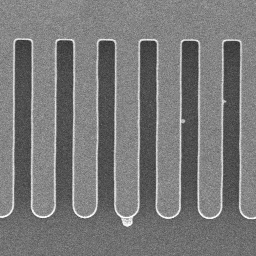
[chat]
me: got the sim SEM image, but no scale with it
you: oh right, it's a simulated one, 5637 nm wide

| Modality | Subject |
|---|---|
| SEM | groups of lines, slits or small figures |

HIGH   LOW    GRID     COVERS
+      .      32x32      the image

++++++++++++++++++++++++++++++++
++++++++++++++++++++++++++++++++
++++++++++++++++++++++++++++++++
++++++++++++++++++++++++++++++++
++++++++++++++++++++++++++++++++
++..+++..+++..++++..+++..+++..++
++..+++..+++..+++...+++..+++..++
++..+++..+++..+++...+++..+++..++
++..+++..+++..+++...+++..+++..++
++..+++..+++..+++...+++..+++..++
++..+++..+++..+++...+++..+++..++
++..+++..+++..+++...+++..+++..++
++..+++..+++..+++...+++..+++..++
++..+++..+++..+++...+++..+++..++
++..+++..+++..+++...+++..+++..++
++..+++..+++..+++...+++..+++..++
++..+++..+++..+++...+++..+++..++
++..+++..+++..+++...+++..+++..++
++..+++..+++..+++...+++..+++..++
++..+++..+++..+++...+++..+++..++
++..+++..+++..+++...+++..+++..++
++..+++..+++..+++...++...+++..++
++..+++..+++..+++...++...+++..++
++..+++..+++..+++...++...+++..++
++..+++..+++..+++...++...+++..++
++..+++..+++..+++...++...+++..++
+...+++..+++...++...++...+++..++
................................
................................
................................
................................
................................